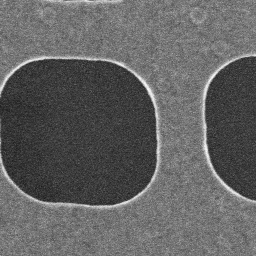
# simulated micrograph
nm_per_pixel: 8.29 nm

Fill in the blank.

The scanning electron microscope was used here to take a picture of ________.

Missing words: holes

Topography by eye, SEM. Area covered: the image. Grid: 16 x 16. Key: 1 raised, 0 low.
1111111111111111
1111111111111111
1111111111111111
1111111111111111
1000000011111100
0000000001111000
0000000000111000
0000000000111000
0000000000111000
0000000000111000
0000000000111000
1000000001111100
1100000011111111
1111111111111111
1111111111111111
1111111111111111